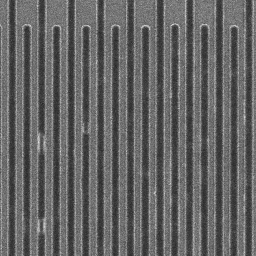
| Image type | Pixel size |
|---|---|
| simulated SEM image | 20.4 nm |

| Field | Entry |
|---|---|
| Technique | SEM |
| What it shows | parallel lines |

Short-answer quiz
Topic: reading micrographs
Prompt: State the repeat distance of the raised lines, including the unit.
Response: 0.301 um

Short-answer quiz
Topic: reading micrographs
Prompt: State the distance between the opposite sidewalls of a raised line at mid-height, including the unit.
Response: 184 nm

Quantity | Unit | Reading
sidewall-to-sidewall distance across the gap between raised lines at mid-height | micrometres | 0.117